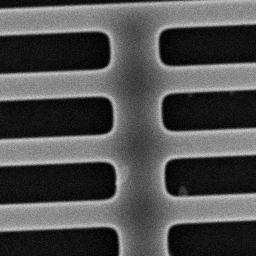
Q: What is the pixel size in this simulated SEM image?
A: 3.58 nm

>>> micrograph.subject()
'groups of lines, slits or small figures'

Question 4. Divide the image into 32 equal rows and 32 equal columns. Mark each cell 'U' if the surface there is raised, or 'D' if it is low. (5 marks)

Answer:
DDDDDDDDDDDDDDDDUUUUUUUUUUUUUUUU
UUUUUUUUUUUUUUUUUUUUUUUUUUUUUUUU
UUUUUUUUUUUUUUUUUUUUUUUUUUUUUUUU
UUUUUUUUUUUUUUUUUUUUUDDDDDDDDDDD
DDDDDDDDDDDDDUUUUUUUDDDDDDDDDDDD
DDDDDDDDDDDDDDUUUUUUDDDDDDDDDDDD
DDDDDDDDDDDDDDUUUUUUDDDDDDDDDDDD
DDDDDDDDDDDDDDUUUUUUDDDDDDDDDDDD
DDDDDDDDDDDDDUUUUUUUUUUUUUUUUUUU
UUUUUUUUUUUUUUUUUUUUUUUUUUUUUUUU
UUUUUUUUUUUUUUUUUUUUUUUUUUUUUUUU
UUUUUUUUUUUUUUUUUUUUUUUDDDDDDDDD
DDDDDDDDDDDDDDUUUUUUDDDDDDDDDDDD
DDDDDDDDDDDDDDUUUUUUDDDDDDDDDDDD
DDDDDDDDDDDDDDUUUUUUDDDDDDDDDDDD
DDDDDDDDDDDDDDUUUUUUDDDDDDDDDDDD
DDDDDDDDDDDDDDUUUUUUUUDUUUUUUUUU
DUUUUUUUUUUUUUUUUUUUUUUUUUUUUUUU
UUUUUUUUUUUUUUUUUUUUUUUUUUUUUUUU
UUUUUUUUUUUUUUUUUUUUUUUUUUUDDDDD
UUUUUDDDDDDDDDUUUUUUUDDDDDDDDDDD
DDDDDDDDDDDDDDDUUUUUUDDDDDDDDDDD
DDDDDDDDDDDDDDDUUUUUUDDDDDDDDDDD
DDDDDDDDDDDDDDDUUUUUUDDDDDDDDDDD
DDDDDDDDDDDDDDUUUUUUUUDDDDUUUUUU
DDDUUUUUUUUUUUUUUUUUUUUUUUUUUUUU
UUUUUUUUUUUUUUUUUUUUUUUUUUUUUUUU
UUUUUUUUUUUUUUUUUUUUUUUUUUUUUUDD
UUUUUUUDDDDDDDUUUUUUUDDDDDDDDDDD
DDDDDDDDDDDDDDDUUUUUUDDDDDDDDDDD
DDDDDDDDDDDDDDDUUUUUUDDDDDDDDDDD
DDDDDDDDDDDDDDDUUUUUUDDDDDDDDDDD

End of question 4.